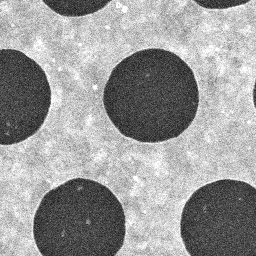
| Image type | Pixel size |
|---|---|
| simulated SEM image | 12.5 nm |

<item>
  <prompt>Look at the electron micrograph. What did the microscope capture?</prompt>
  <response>holes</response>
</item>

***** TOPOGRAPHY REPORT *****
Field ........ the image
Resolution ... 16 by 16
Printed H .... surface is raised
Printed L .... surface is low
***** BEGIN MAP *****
HHHLLLHHHHHHHLHH
HHHHHHHHHHHHHHHH
HHHHHHHHHHHHHHHH
LLHHHHHHLLLHHHHH
LLLHHHHLLLLLHHHH
LLLHHHHLLLLLHHHH
LLLHHHLLLLLLHHHH
LLLHHHHLLLLLHHHH
LLHHHHHHLLLHHHHH
HHHHHHHHHHHHHHHH
HHHHHHHHHHHHHHHH
HHHHLLHHHHHHHLLL
HHHLLLLHHHHHLLLL
HHLLLLLLHHHLLLLL
HHLLLLLLHHHLLLLL
HHLLLLLLHHHHLLLL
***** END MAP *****